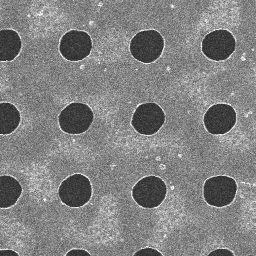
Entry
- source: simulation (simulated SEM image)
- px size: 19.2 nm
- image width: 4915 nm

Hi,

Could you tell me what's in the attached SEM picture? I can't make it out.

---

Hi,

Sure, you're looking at a regular array of holes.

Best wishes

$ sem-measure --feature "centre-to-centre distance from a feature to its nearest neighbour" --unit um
1.37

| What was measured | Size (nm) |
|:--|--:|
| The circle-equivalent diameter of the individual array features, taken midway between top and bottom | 630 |